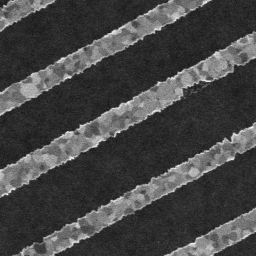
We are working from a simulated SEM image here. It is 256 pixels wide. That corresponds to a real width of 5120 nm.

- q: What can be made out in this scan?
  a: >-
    one or a few lines or trenches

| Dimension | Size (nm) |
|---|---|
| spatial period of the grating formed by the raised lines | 1490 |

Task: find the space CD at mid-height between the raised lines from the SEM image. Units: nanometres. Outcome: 1100